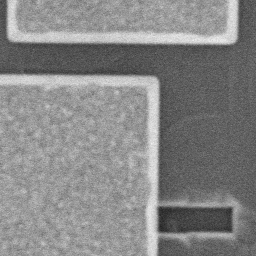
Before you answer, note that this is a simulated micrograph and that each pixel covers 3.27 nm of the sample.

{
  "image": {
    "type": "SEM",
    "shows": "wiring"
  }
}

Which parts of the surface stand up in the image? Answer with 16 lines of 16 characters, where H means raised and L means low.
LHHHHHHHHHHHHHHL
LHHHHHHHHHHHHHHL
LLLLLLLLLLLLLLLL
LLLLLLLLLLLLLLLL
LLLLLLLLLLLLLLLL
HHHHHHHHHHLLLLLL
HHHHHHHHHHLLLLLL
HHHHHHHHHHLLLLLL
HHHHHHHHHHLLLLLL
HHHHHHHHHHLLLLLL
HHHHHHHHHHLLLLLL
HHHHHHHHHHLLLLLL
HHHHHHHHHHLLLLLL
HHHHHHHHHLLLLLLL
HHHHHHHHHLLLLLLL
HHHHHHHHHHLLLLLL